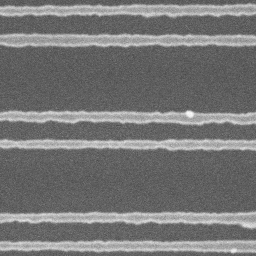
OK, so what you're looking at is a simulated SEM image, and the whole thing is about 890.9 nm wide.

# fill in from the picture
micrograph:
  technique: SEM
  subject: lines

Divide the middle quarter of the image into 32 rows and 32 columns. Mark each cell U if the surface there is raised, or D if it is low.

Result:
DDDDDDDDDDDDDDDDDDDDDDDDDDDDDDDD
DDDDDDDDDDDDDDDDDDDDDDDDDDDDDDDD
DDDDDDDDDDDDDDDDDDDDDDDDDDDDDDDD
DDDDDDDDDDDDDDDDDDDDDDDDDDDDDDDD
DDDDDDDDDDDDDDDDDDDDDDDDDDDDDDDD
DDDDDDDDDDDDDDDDDDDDDDDDDDDDDDDD
DDDDDDDDDDDDDDDDDDDDDDDDDDDDDDDD
DDDDDDDDDDDDDDDDDDDDDDDDDDDDDDDD
DDDDDDDDDDDDDDDDDDDDDDDDDDDDDDDD
DDDDDDDDDDDDDDDDDDDDDDDDDDDDDDDD
DDDDDDDDDDDDDDDDDDDDDDDDDDDDDDDD
DDDDDDDDDDDDDDDDDDDDDDDDDDDDDDDD
UUUUUUUUUUUUUUUUUUUUUUUUUUUUUUUU
UUUUUUUUUUUUUUUUUUUUUUUUUUUUUUUU
DUUDDDDDDDDDDDUDDDUUUDDDDDDDUUUU
DDDDDDDDDDDDDDDDDDDDDDDDDDDDDDDD
DDDDDDDDDDDDDDDDDDDDDDDDDDDDDDDD
DDDDDDDDDDDDDDDDDDDDDDDDDDDDDDDD
DDDDDDDDDDDDDDDDDDDDDDDDDDDDDDDD
UUUUUUUUUUUUUUUUUUUUUUUUUUUUUUUU
UUUUUUUUUUUUUUUUUUUUUUUUUUUUUUUU
DDDDDDDDDDDDDDDDDDDDDDDDDDDDDDDD
DDDDDDDDDDDDDDDDDDDDDDDDDDDDDDDD
DDDDDDDDDDDDDDDDDDDDDDDDDDDDDDDD
DDDDDDDDDDDDDDDDDDDDDDDDDDDDDDDD
DDDDDDDDDDDDDDDDDDDDDDDDDDDDDDDD
DDDDDDDDDDDDDDDDDDDDDDDDDDDDDDDD
DDDDDDDDDDDDDDDDDDDDDDDDDDDDDDDD
DDDDDDDDDDDDDDDDDDDDDDDDDDDDDDDD
DDDDDDDDDDDDDDDDDDDDDDDDDDDDDDDD
DDDDDDDDDDDDDDDDDDDDDDDDDDDDDDDD
DDDDDDDDDDDDDDDDDDDDDDDDDDDDDDDD